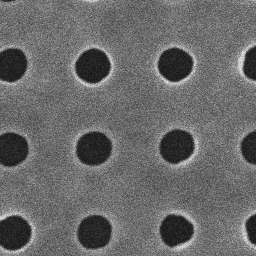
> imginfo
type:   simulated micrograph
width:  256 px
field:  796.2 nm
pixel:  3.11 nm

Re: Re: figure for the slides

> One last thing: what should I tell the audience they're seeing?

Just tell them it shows holes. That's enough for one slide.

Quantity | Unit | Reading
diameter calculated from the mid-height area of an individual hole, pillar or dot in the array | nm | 106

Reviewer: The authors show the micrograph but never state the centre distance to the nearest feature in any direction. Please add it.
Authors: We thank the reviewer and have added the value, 254 nanometers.